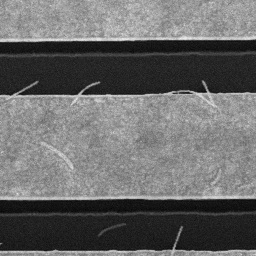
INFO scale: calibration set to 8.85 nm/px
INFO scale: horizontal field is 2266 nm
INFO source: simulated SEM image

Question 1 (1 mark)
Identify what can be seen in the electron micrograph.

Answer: lines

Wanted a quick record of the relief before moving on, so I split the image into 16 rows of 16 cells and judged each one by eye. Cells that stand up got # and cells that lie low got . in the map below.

################
################
########........
................
................
................
################
################
################
################
################
################
................
................
................
................